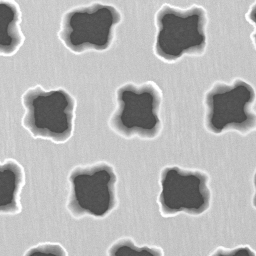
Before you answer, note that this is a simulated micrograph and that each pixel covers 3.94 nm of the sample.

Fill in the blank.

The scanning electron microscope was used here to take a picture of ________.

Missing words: holes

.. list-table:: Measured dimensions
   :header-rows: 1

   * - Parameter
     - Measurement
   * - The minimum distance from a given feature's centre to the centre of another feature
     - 350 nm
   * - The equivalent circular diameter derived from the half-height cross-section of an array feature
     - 46.3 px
